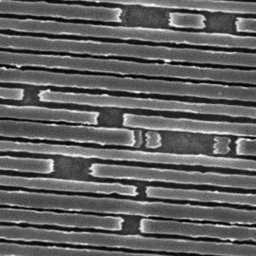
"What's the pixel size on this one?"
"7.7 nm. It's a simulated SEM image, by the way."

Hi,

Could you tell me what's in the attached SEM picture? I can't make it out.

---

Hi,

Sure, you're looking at parallel lines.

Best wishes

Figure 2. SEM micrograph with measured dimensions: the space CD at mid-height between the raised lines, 35.5 nanometres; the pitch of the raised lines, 133 nanometres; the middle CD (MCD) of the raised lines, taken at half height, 99.7 nanometres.